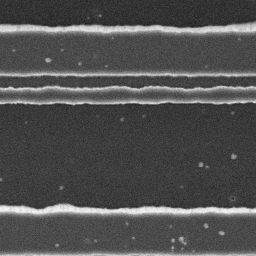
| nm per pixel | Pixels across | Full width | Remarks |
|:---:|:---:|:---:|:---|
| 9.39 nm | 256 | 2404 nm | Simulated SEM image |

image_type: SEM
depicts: lines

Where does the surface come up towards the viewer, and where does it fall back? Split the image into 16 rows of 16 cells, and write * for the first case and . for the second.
................
................
****************
****************
****************
****************
................
................
................
................
................
................
................
****************
****************
****************